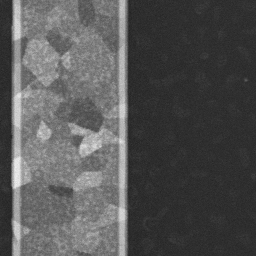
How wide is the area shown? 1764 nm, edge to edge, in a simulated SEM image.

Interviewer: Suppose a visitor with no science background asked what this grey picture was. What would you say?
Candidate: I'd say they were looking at one or a few lines or trenches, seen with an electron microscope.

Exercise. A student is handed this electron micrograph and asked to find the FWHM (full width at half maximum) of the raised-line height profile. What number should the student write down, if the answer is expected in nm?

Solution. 724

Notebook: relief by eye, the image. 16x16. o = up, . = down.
.ooooooo........
.ooooooo........
.ooooooo........
.ooooooo........
.ooooooo........
.ooooooo........
.ooooooo........
.ooooooo........
.ooooooo........
.ooooooo........
.ooooooo........
.ooooooo........
.ooooooo........
.ooooooo........
.ooooooo........
.ooooooo........